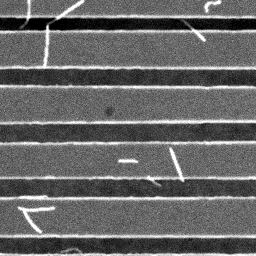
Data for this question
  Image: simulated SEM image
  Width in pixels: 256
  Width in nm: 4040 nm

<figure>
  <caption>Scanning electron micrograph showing lines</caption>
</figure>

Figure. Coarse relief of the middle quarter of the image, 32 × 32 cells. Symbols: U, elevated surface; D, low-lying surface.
UUUUUUUUUUUUUUUUUUUUUUUUUUUUUUUU
DDDDDDDDDDDDDDDDDDDDDDDDDDDDDDDD
DDDDDDDDDDDDDDDDDDDDDDDDDDDDDDDD
DDDDDDDDDDDDDDDDDDDDDDDDDDDDDDDD
DDDDDDDDDDDDDDDDDDDDDDDDDDDDDDDD
DUDDDDDDDDDDDDDDDDDDDDDDDDDDDDDD
UUUUUUUUUUUUUUUUUUUUUUUUUUUUUUUU
UUUUUUUUUUUUUUUUUUUUUUUUUUUUUUUU
UUUUUUUUUUUUUUUUUUUUUUUUUUUUUUUU
UUUUUUUUUUUUUUUUUUUUUUUUUUUUUUUU
UUUUUUUUUUUUUUUUUUUUUUUUUUUUUUUU
UUUUUUUUUUUUUUUUUUUUUUUUUUUUUUUU
UUUUUUUUUUUUUUUUUUUUUUUUUUUUUUUU
UUUUUUUUUUUUUUUUUUUUUUUUUUUUUUUU
UUUUUUUUUUUUUUUUUUUUUUUUUUUUUUUU
DDDDDDDDDDDDDDDDDDDDDDDDDDDDDDDD
DDDDDDDDDDDDDDDDDDDDDDDDDDDDDDDD
DDDDDDDDDDDDDDDDDDDDDDDDDDDDDDDD
DDDDDDDDDDDDDDDDDDDDDDDDDDDDDDDD
DDDDDDDDDDDDDDDDDDDDDDDUDDDDDDDD
UUUUUUUUUUUUUUUUUUUUUUUUUUUUUUUU
UUUUUUUUUUUUUUUUUUUUUUUUUUUUUUUU
UUUUUUUUUUUUUUUUUUUUUUUUUUUUUUUU
UUUUUUUUUUUUUUUUUUUUUUUUUUUUUUUU
UUUUUUUUUUUUUUUUUUUUUUUUUUUUUUUU
UUUUUUUUUUUUUUUUUUUUUUUUUUUUUUUU
UUUUUUUUUUUUUUUUUUUUUUUUUUUUUUUU
UUUUUUUUUUUUUUUUUUUUUUUUUUUUUUUU
UUUUUUUUUUUUUUUUUUUUUUUUUUUUUUUU
DDDDDDDDDDDDDDDDDDDDDDDDDDDDDDDD
DDDDDDDDDDDDDDDDDDDDDDDDDDDDDDDD
DDDDDDDDDDDDDDDDDDDDDDDDDDDDDDDD